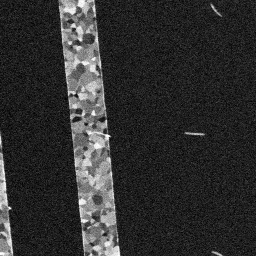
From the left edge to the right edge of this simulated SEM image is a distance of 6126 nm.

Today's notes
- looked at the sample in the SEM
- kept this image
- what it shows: one or a few lines or trenches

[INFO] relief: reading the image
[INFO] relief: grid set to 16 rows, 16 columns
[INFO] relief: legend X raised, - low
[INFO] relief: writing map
----XX----------
----XX----------
----XX----------
----XX----------
----XX----------
----XX----------
----XXX---------
----XXX---------
-----XX---------
-----XX---------
-----XX---------
-----XX---------
-----XX---------
X----XX---------
X----XX---------
X----XX---------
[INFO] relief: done